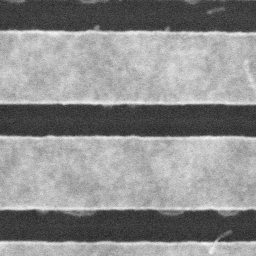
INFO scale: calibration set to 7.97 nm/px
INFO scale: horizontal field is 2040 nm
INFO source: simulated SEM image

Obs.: lines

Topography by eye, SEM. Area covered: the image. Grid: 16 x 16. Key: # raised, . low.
................
................
################
################
################
################
......##..##..##
................
................
################
################
################
################
................
................
################